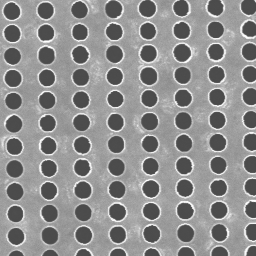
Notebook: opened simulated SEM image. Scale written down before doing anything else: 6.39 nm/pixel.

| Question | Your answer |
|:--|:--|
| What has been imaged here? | a regular array of holes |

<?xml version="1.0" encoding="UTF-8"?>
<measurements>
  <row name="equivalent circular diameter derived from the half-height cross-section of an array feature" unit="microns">0.105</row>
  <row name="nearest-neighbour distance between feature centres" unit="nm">142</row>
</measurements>